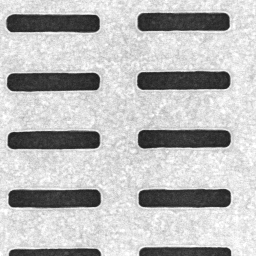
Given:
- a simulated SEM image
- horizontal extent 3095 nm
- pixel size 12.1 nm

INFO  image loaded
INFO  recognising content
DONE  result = a regular array of holes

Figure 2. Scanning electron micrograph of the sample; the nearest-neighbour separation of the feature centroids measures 58.3 px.